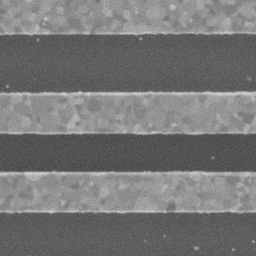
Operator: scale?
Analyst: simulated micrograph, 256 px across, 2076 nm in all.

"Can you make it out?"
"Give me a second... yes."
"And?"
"lines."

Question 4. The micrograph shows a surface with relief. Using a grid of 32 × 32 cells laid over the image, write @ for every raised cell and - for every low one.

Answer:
@@@@@@@@@@@@@@@@@@@@@@@@@@@@@@@@
@@@@@@@@@@@@@@@@@@@@@@@@@@@@@@@@
@@@@@@@@@@@@@@@@@@@@@@@@@@@@@@@@
@@@@@@@@@@@@@@@@@@@@@@@@@@@@@@@@
--------------------------------
--------------------------------
--------------------------------
--------------------------------
--------------------------------
--------------------------------
--------------------------------
--------------------------------
@@@@@@@@@@@@@@@@@@@@@@@@@@@@@@@@
@@@@@@@@@@@@@@@@@@@@@@@@@@@@@@@@
@@@@@@@@@@@@@@@@@@@@@@@@@@@@@@@@
@@@@@@@@@@@@@@@@@@@@@@@@@@@@@@@@
@@@@@@@@@@@@@@@@@@@@@@@@@@@@@@@@
--------------------------------
--------------------------------
--------------------------------
--------------------------------
--------------------------------
@@@@@@@@@@@@@@@@@@@@@@@@@@@@@@@@
@@@@@@@@@@@@@@@@@@@@@@@@@@@@@@@@
@@@@@@@@@@@@@@@@@@@@@@@@@@@@@@@@
@@@@@@@@@@@@@@@@@@@@@@@@@@@@@@@@
-------------@@@---------@----@-
--------------------------------
--------------------------------
--------------------------------
--------------------------------
--------------------------------